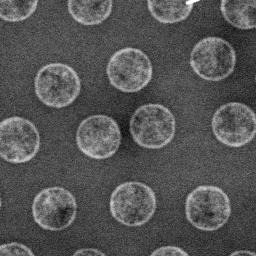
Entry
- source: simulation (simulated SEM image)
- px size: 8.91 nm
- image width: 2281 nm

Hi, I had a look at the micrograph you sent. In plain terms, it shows a regular array of raised bodies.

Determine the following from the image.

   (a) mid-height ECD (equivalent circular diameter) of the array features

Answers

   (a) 379 nm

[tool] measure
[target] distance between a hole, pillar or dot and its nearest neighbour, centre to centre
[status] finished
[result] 70.5 pixels